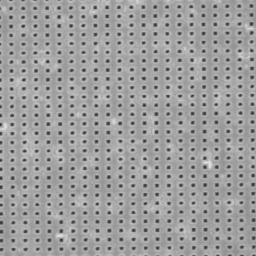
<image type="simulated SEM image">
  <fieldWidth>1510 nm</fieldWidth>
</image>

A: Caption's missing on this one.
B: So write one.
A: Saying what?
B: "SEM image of a regular array of holes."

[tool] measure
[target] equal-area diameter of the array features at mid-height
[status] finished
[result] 22.1 nm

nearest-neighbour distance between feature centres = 51.9 nanometers